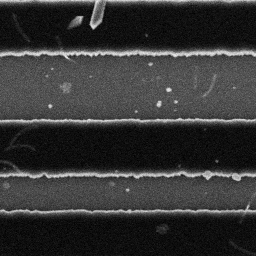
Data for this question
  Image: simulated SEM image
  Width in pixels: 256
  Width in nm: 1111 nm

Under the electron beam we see lines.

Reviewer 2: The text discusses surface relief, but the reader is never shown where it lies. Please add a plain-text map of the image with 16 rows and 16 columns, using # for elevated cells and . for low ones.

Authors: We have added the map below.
################
################
################
................
................
................
................
..#....##.######
################
################
################
................
................
################
################
################